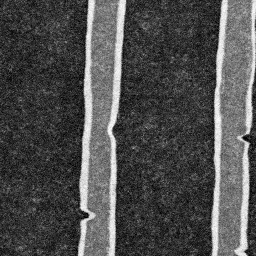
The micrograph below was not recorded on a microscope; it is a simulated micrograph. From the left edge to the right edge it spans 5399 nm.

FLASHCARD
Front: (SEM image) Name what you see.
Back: one or a few lines or trenches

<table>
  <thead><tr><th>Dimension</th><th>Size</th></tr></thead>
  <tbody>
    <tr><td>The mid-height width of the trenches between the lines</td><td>2180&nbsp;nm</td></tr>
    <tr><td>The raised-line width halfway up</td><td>608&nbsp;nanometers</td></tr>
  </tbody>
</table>